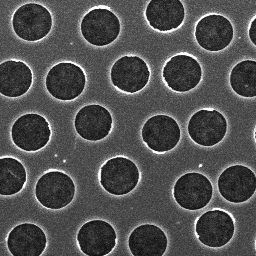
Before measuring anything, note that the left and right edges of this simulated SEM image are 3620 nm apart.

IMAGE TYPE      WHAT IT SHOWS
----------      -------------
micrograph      a regular array of holes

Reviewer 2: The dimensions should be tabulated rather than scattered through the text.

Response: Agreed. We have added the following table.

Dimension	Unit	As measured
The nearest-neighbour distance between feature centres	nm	726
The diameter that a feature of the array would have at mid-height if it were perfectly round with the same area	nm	536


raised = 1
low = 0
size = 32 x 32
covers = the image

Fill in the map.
11100111111111111110000111111111
11000011111000111100000111111111
11000011110000011100000110001111
11000011110000011110001110000110
11000011110000011111111100000110
11111111111000111111111110000111
11111111111111111111111111111111
11111111111111100011100011111111
00001100001111000011100001111000
00001100000111000001000001111000
00001100000111000011100001111000
00011100001111110111111111111000
11111111111111111111111111111111
11111111110001111111111111111111
11100111110000111110011100001111
11000011100000111100001100001111
10000011110000111100000100001111
11000011111011111100001100001111
11000111111111111110001111111111
11111111111111111111111111111111
00011111111110000111111111111111
00011101111110000111111111110000
00011000011110000111110000100000
00010000011110000111110000000000
11111000011111111111110000110001
11111000111111111111110000111111
11111111111111111111111111001111
11111111111111111111111110000111
11000111110000111000111100000111
10000011110000110000011110000111
10000011110000110000011111001111
10000111110000110000011111111111